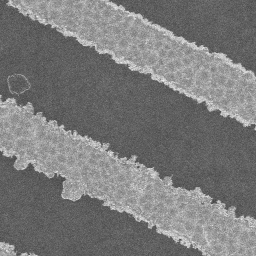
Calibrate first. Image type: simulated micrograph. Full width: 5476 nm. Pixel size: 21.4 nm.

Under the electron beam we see one or a few lines or trenches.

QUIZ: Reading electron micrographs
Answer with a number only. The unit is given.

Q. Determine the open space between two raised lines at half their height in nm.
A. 1840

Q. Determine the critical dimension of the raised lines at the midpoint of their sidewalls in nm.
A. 975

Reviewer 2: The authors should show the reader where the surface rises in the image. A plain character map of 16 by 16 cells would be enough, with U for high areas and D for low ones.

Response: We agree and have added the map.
DUUUUUUDDDDDDDDD
DDDUUUUUUDDDDDDD
DDDDDUUUUUUDDDDD
DDDDDDDUUUUUUUDD
DDDDDDDDDUUUUUUD
DDDDDDDDDDDUUUUU
UDDDDDDDDDDDDUUU
UUUDDDDDDDDDDDDU
UUUUUDDDDDDDDDDD
UUUUUUUDDDDDDDDD
DDUUUUUUUDDDDDDD
DDDDUUUUUUUDDDDD
DDDDDDDUUUUUUDDD
DDDDDDDDUUUUUUUD
DDDDDDDDDDUUUUUU
DDDDDDDDDDDDUUUU